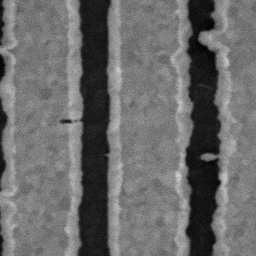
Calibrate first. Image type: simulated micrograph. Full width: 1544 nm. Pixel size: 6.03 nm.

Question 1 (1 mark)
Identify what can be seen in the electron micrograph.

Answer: one or a few lines or trenches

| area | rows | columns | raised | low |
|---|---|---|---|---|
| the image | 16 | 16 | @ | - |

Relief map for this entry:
@@@@@--@@@@@--@@
@@@@@--@@@@@--@@
@@@@@--@@@@--@@@
@@@@@--@@@@---@@
@@@@@--@@@@---@@
@@@@@--@@@@---@@
@@@@@--@@@@@--@@
-@@@@--@@@@@--@@
-@@@@--@@@@@--@@
-@@@@--@@@@@--@@
-@@@@--@@@@@--@@
@@@@@--@@@@---@@
@@@@@--@@@@@--@@
@@@@@--@@@@@--@@
@@@@@--@@@@@--@@
@@@@@--@@@@@--@@